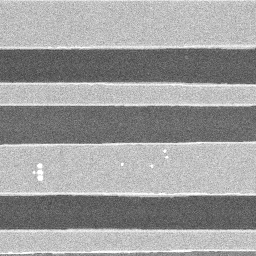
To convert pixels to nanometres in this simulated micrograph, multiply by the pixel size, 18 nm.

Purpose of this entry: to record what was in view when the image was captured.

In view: lines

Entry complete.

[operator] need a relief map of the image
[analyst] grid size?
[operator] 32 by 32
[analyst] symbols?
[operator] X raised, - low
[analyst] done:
XXXXXXXXXXXXXXXXXXXXXXXXXXXXXXXX
XXXXXXXXXXXXXXXXXXXXXXXXXXXXXXXX
XXXXXXXXXXXXXXXXXXXXXXXXXXXXXXXX
XXXXXXXXXXXXXXXXXXXXXXXXXXXXXXXX
XXXXXXXXXXXXXXXXXXXXXXXXXXXXXXXX
XXXXXXXXXXXXXXXXXXXXXXXXXXXXXXXX
--------------------------------
--------------------------------
--------------------------------
--------------------------------
XXXXXXXXXXXXXXX-----------------
XXXXXXXXXXXXXXXXXXXXXXXXXXXXXXXX
XXXXXXXXXXXXXXXXXXXXXXXXXXXXXXXX
--------------------------------
--------------------------------
--------------------------------
--------------------------------
--------------------------------
XXXXXXXXXXXXXXXXXXXXXXXXXXXXXXXX
XXXXXXXXXXXXXXXXXXXXXXXXXXXXXXXX
XXXXXXXXXXXXXXXXXXXXXXXXXXXXXXXX
XXXXXXXXXXXXXXXXXXXXXXXXXXXXXXXX
XXXXXXXXXXXXXXXXXXXXXXXXXXXXXXXX
XXXXXXXXXXXXXXXXXXXXXXXXXXXXXXXX
--------------------------------
--------------------------------
--------------------------------
--------------------------------
--------------------------------
XXXXXXXXXXXXXXXXXXXXXXXXXXXXXXXX
XXXXXXXXXXXXXXXXXXXXXXXXXXXXXXXX
XXXXXXXXXXXX--------------------